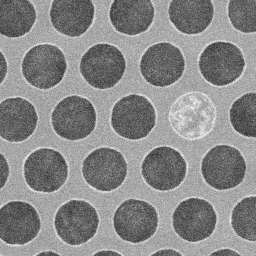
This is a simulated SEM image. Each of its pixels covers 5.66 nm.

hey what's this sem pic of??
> a regular array of holes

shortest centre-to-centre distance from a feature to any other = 0.335 microns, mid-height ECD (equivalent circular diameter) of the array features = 257 nm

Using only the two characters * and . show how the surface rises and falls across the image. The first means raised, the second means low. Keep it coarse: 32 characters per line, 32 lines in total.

....**......**.....**......**...
....**......**.....**......*....
.....*......**.....**......**...
....***....***.....***....***...
*..*****..**********************
*************.******..****...***
***.....***....***.....**.....**
.**.....**......**.....**......*
.**.....**......*......**......*
.**.....**.....***.....**.....**
****...****....****..*****...***
********************************
...*****...****....***....****..
....***.....**.....***.....**...
.....*......**......*......**...
.....*......**.....**......**...
....***.....**.....***....****..
*..******.**********************
*****.******..*****...*****..***
.***....***....***.....***....**
.**.....**......**.....**......*
.**......*......**.....**......*
.**.....***.....**.....***....**
****...*****...****...*****..***
********************************
*...****...****....***....****..
.....**.....**......**.....**...
.....**.....**......**.....**...
.....**.....**......**.....**...
.....**.....***....***....****..
*..******.**********************
*****..*****...****...*****...**